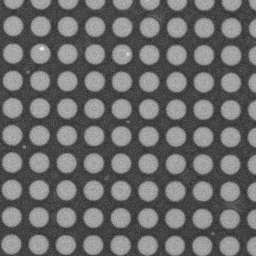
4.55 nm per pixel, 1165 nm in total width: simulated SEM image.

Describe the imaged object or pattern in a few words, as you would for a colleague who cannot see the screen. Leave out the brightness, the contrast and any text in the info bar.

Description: an array of small figures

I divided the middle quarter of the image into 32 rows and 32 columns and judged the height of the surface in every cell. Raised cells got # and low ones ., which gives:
................................
................................
###...###....###....###....###..
###..#####..#####..#####..####..
###..#####..#####..#####..#####.
###...####..#####..#####..####..
##....###....###....###....###..
................................
................................
###...###....###....###....###..
###..#####..#####..#####..####..
###..#####..#####..#####..####..
###...####..#####..####...####..
#......#......#.....##.....##...
................................
................................
###...###...####...####...####..
###..#####..#####..#####..####..
###..#####..#####..#####..####..
###...####..####...####...####..
....................##.....##...
................................
##.....#......#.................
###..#####..####...####...####..
###..#####..#####..#####..####..
###..#####..#####..#####..####..
##....###...####...####...####..
................................
................................
##....###....##.....##.....##...
###..#####..####...####...####..
###..#####..#####..####..#####..